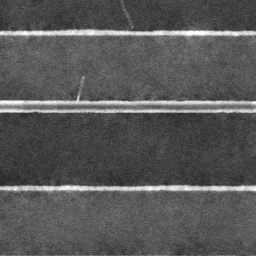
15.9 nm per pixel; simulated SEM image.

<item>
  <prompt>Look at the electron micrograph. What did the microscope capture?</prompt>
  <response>lines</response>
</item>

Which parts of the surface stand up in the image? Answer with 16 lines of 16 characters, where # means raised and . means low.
................
................
################
################
################
################
################
................
................
................
................
................
################
################
################
################